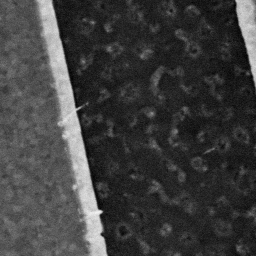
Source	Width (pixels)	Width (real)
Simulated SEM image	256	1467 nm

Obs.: one or a few lines or trenches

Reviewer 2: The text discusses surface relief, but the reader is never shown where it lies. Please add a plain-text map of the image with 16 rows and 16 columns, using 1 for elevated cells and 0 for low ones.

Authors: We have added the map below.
1110000000000001
1110000000000001
1110000000000000
1111000000000000
1111000000000000
1111000000000000
1111000000000000
1111100000000000
1111100000000000
1111100000000000
1111100000000000
1111100000000000
1111110000000000
1111110000000000
1111110000000000
1111110000000000